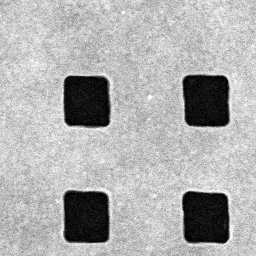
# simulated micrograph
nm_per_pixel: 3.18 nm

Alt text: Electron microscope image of holes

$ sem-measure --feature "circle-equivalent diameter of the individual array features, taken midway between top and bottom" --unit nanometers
170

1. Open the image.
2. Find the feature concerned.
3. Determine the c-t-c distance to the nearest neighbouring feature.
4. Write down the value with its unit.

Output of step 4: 370 nanometers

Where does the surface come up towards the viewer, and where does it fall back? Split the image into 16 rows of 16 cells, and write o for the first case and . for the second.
oooooooooooooooo
oooooooooooooooo
oooooooooooooooo
oooooooooooooooo
oooooooooooooooo
oooo...oooo...oo
oooo...oooo...oo
oooo...ooooo..oo
oooooooooooooooo
oooooooooooooooo
oooooooooooooooo
oooooooooooooooo
oooo...oooo...oo
oooo...oooo...oo
oooo...ooooo..oo
oooooooooooooooo